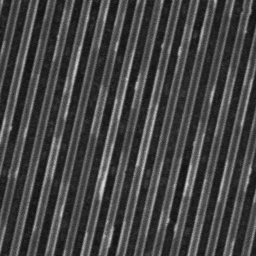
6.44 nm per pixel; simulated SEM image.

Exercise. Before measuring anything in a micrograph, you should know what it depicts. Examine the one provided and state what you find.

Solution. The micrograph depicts parallel lines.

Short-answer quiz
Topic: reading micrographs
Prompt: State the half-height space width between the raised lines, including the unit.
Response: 9.89 pixels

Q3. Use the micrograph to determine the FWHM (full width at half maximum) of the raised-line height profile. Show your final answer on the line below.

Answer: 51.1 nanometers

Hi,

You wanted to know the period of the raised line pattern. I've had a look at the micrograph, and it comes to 112 nm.